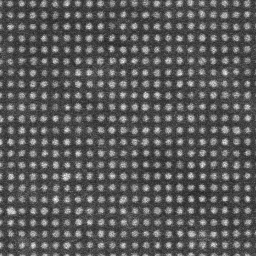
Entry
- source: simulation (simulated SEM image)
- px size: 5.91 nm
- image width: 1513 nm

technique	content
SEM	a regular array of raised bodies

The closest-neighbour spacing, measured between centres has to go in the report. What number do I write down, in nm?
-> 65.2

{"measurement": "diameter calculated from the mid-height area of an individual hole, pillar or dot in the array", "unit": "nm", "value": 33.3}